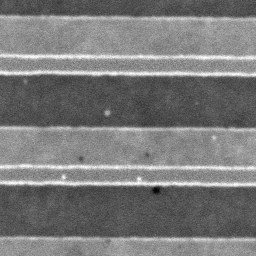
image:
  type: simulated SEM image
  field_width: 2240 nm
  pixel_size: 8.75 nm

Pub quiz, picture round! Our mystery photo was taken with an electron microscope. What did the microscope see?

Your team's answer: lines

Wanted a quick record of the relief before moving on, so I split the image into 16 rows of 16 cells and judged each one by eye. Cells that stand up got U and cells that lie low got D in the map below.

DDDDDDDDDDDDDDDD
UUUUUUUUUUUUUUUU
UUUUUUUUUUUUUUUU
UUUUUUUUUUUUUUUU
UUUUUUUUUUUUUUUU
DDDDDDDDDDDDDDDD
DDDDDDDDDDDDDDDD
DDDDDDDDDDDDDDDD
UUUUUUUUUUUUUUUU
UUUUUUUUUUUUUUUU
UUUUUUUUUUUUUUUU
DDUDUUUUUUUUUUUU
DDDDDDDDDDDDDDDD
DDDDDDDDDDDDDDDD
DDDDDDDDDDDDDDDD
UUUUUUUUUUUUUUUU